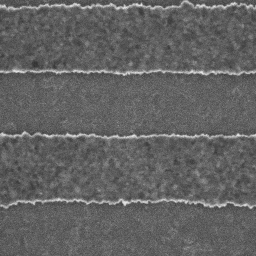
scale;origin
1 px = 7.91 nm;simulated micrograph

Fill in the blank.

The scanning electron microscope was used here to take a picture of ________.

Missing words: one or a few lines or trenches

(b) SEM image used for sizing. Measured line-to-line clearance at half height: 492 nm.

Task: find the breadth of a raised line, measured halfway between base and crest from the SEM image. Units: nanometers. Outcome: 530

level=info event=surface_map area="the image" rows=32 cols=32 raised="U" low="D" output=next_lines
DDDDDDDDDDDDDDDDDDDDDDDUDDDDDDDD
UUUUUUUUUUUUUUUUUUUUUUUUUUUUUUUU
UUUUUUUUUUUUUUUUUUUUUUUUUUUUUUUU
UUUUUUUUUUUUUUUUUUUUUUUUUUUUUUUU
UUUUUUUUUUUUUUUUUUUUUUUUUUUUUUUU
UUUUUUUUUUUUUUUUUUUUUUUUUUUUUUUU
UUUUUUUUUUUUUUUUUUUUUUUUUUUUUUUU
UUUUUUUUUUUUUUUUUUUUUUUUUUUUUUUU
UUUUUUUUUUUUUUUUUUUUUUUUUUUUUUUU
DDDDDDDDDDDDDDDDDDDDDDDDDDDDDDDD
DDDDDDDDDDDDDDDDDDDDDDDDDDDDDDDD
DDDDDDDDDDDDDDDDDDDDDDDDDDDDDDDD
DDDDDDDDDDDDDDDDDDDDDDDDDDDDDDDD
DDDDDDDDDDDDDDDDDDDDDDDDDDDDDDDD
DDDDDDDDDDDDDDDDDDDDDDDDDDDDDDDD
DDDDDDDDDDDDDDDDDDDDDDDDDDDDDDDD
DDDDDDDDDDDDDDDDDDDDDDDDDDDDDDDD
UUUUUUUUUUUUUUUUUUUUUUUUUUUUUUUU
UUUUUUUUUUUUUUUUUUUUUUUUUUUUUUUU
UUUUUUUUUUUUUUUUUUUUUUUUUUUUUUUU
UUUUUUUUUUUUUUUUUUUUUUUUUUUUUUUU
UUUUUUUUUUUUUUUUUUUUUUUUUUUUUUUU
UUUUUUUUUUUUUUUUUUUUUUUUUUUUUUUU
UUUUUUUUUUUUUUUUUUUUUUUUUUUUUUUU
UUUUUUUUUUUUUUUUUUUUUUUUUUUUUUUU
UUDDDDDDDDDDDDDDDDDDDDDDDUUUDUUU
DDDDDDDDDDDDDDDDDDDDDDDDDDDDDDDD
DDDDDDDDDDDDDDDDDDDDDDDDDDDDDDDD
DDDDDDDDDDDDDDDDDDDDDDDDDDDDDDDD
DDDDDDDDDDDDDDDDDDDDDDDDDDDDDDDD
DDDDDDDDDDDDDDDDDDDDDDDDDDDDDDDD
DDDDDDDDDDDDDDDDDDDDDDDDDDDDDDDD